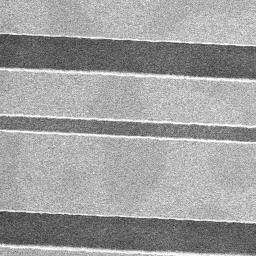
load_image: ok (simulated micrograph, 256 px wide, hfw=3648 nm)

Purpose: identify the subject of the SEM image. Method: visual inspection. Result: lines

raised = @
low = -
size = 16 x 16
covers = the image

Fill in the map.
@@@@@@@@@@@@@@@@
@@@@@@@@@@@@@@@@
--------@@@@@@@@
----------------
@@@-------------
@@@@@@@@@@@@@@@@
@@@@@@@@@@@@@@@@
@@@@@@@@@@@@@@@@
@@@@@@@@@@@@@@@@
@@@@@@@@@@@@@@@@
@@@@@@@@@@@@@@@@
@@@@@@@@@@@@@@@@
@@@@@@@@@@@@@@@@
-------@@@@@@@@@
----------------
@@@-------------